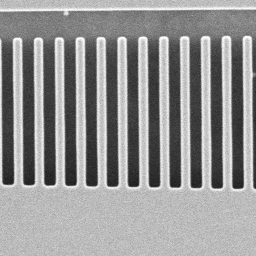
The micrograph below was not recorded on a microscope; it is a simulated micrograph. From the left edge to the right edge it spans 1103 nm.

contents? groups of lines, slits or small figures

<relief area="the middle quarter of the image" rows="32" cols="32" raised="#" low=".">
...##...##...###...##...##...##.
...##...##...###...##...##...##.
...##...##...###...##...##...##.
...##...##...###...##...##...##.
...##...##....##...##...##...##.
...##...##....##...##...##...##.
...##...##....##...##...##...##.
...##...##....##...##...##...##.
...##...##....##...##...##...##.
...##...##....##...##...##...##.
...##...##....##...##...##...##.
...##...##....##...##...##...##.
...##...##....##...##...##...##.
...##...##....##...##...##...##.
...##...###...##...##...##...##.
...##...###...##...##...##...##.
...##...###...##...##...##...##.
...##...###...##...##...##...##.
...##...###...##...##...##...##.
...##...###...##...##...##...##.
...##...###...##...##...##...##.
...##...###...##...##...##...##.
...##...###...##...##...##...##.
...##....##...##...##...##...##.
...##....##...##...##...##...##.
...##....##...##...##...##...##.
...##....##...##...##...##...##.
...##....##...##...##...##...##.
...##....##...##...##...##...##.
...##....##...##...##...##...##.
#..###..###..###...##...##...###
################################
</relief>